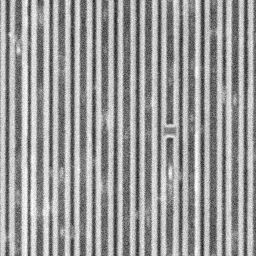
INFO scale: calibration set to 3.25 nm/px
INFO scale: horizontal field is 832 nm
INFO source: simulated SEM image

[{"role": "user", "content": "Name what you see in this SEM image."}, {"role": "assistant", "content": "parallel lines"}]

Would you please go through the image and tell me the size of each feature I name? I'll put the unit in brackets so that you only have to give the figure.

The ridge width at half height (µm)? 0.0122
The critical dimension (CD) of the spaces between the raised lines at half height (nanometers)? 18.3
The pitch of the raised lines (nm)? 35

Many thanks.